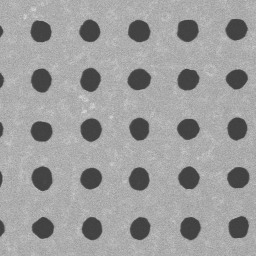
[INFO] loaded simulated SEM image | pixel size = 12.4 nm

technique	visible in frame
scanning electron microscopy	a regular array of holes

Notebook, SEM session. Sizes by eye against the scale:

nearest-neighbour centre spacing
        0.602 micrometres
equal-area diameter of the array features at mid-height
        268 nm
